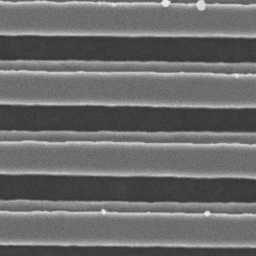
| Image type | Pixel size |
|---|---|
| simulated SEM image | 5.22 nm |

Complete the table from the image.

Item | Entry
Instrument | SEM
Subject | lines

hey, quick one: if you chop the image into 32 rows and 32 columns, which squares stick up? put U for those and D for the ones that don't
UUUUUUUUUUUUUUUUUUUUUUUUUUUUUUUU
UUUUUUUUUUUUUUUUUUUUUUUUUUUUUUUU
UUUUUUUUUUUUUUUUUUUUUUUUUUUUUUUU
UUUUUUUUUUUUUUUUUUUUUUUUUUUUUUUU
DDDDDDDDDDDDDDDDDDDDDDDDDUDDUUUU
DDDDDDDDDDDDDDDDDDDDDDDDDDDDDDDD
DDDDDDDDDDDDDDDDDDDDDDDDDDDDDDDD
DDDDDDDDDDDDDDDDDDDDDDDDDDDDDDDD
UUUUUUUUUUUUUUUUUUUUUUUUUUUUUUUU
UUUUUUUUUUUUUUUUUUUUUUUUUUUUUUUU
UUUUUUUUUUUUUUUUUUUUUUUUUUUUUUUU
UUUUUUUUUUUUUUUUUUUUUUUUUUUUUUUU
UUUUUUUUUUUUUUUUUUUUUUUUUUUUUUUU
DDDDDDDDDDDDDDDDDDDDDDDDDDDDDDDD
DDDDDDDDDDDDDDDDDDDDDDDDDDDDDDDD
DDDDDDDDDDDDDDDDDDDDDDDDDDDDDDDD
UUUUDUUUUUDDUUUDDDDDDDDDDDDDDDDD
UUUUUUUUUUUUUUUUUUUUUUUUUUUUUUUU
UUUUUUUUUUUUUUUUUUUUUUUUUUUUUUUU
UUUUUUUUUUUUUUUUUUUUUUUUUUUUUUUU
UUUUUUUUUUUUUUUUUUUUUUUUUUUUUUUU
UUUUUUUUUUUUUUUUUUUUUUUUUUUUUUUU
DDDDDDDDDDDDDDDDDDDDDDDDDDDDDDDD
DDDDDDDDDDDDDDDDDDDDDDDDDDDDDDDD
DDDDDDDDDDDDDDDDDDDDDDDDDDDDDDDD
UUUUUUUUUUUUUUUUUUUUUUUUUUUUUUUU
UUUUUUUUUUUUUUUUUUUUUUUUUUUUUUUU
UUUUUUUUUUUUUUUUUUUUUUUUUUUUUUUU
UUUUUUUUUUUUUUUUUUUUUUUUUUUUUUUU
UUUUUUUUUUUUUUUUUUUUUUUUUUUUUUUU
UUUUUUUUUUUUUUUUUUUUUUUUUUUUUUUU
DDDDDDDDDDDDDDDDDDDDDDDDDDDDDDDD